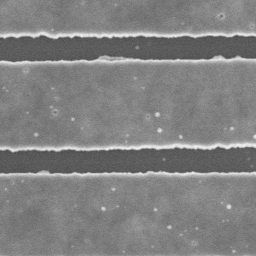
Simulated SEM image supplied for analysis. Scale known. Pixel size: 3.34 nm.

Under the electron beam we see lines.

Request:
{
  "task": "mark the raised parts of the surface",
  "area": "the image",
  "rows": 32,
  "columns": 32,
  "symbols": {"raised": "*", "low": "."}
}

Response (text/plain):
********************************
********************************
********************************
********************************
***.*.***.******..****..*...*...
................................
................................
............*...**....*..*******
********************************
********************************
********************************
********************************
********************************
********************************
********************************
********************************
********************************
********************************
**********************..***.*...
................................
................................
..................***...........
********************************
********************************
********************************
********************************
********************************
********************************
********************************
********************************
********************************
********************************